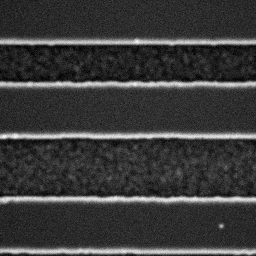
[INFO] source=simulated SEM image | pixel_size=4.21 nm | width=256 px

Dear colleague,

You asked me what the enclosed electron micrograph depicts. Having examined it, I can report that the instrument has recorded lines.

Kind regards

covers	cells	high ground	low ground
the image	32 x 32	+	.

++++++++++++++++++++++++++++++++
++++++++++++++++++++++++++++++++
++++++++++++++++++++++++++++++++
++++++++++++++++++++++++++++++++
++++++++++++++++++++++++++++++++
................................
................................
................................
................................
................................
++++++++++++++++++++++++++++++++
++++++++++++++++++++++++++++++++
++++++++++++++++++++++++++++++++
++++++++++++++++++++++++++++++++
++++++++++++++++++++++++++++++++
++++++++++++++++++++++++++++++++
++++++++++++++++++++++++++++++++
................................
................................
................................
................................
................................
................................
................................
................................
++++++++++++++++++++++++++++++++
++++++++++++++++++++++++++++++++
++++++++++++++++++++++++++++++++
++++++++++++++++++++++++++++++++
++++++++++++++++++++++++++++++++
++++++++++++++++++++++++++++++++
++++++++++++++++++++++++++++++++